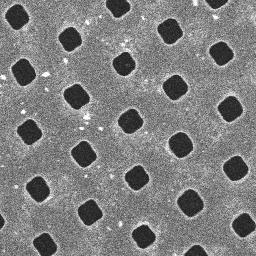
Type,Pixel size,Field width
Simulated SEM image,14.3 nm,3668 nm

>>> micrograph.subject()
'a regular array of holes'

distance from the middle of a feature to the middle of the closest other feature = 56.3 pixels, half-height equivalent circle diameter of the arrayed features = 338 nanometres